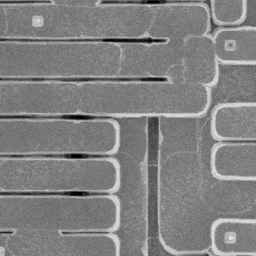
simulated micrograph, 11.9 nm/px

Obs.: wiring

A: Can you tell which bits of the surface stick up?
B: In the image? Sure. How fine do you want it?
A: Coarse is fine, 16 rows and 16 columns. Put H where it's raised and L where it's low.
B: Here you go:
HHHHHHHHHHHHHHHL
HHHHHHHHHHHHHLHL
HHHHHHHHHHHHHHHH
HHHHHHHHHHHHHHHH
HHHHHHHHHHHHHHLL
HHHHHHHHHHHHHLLL
HHHHHHHHHHHHHLLL
HHHHHHHLLLLLLHHH
HHHHHHHLLLLLLLHH
HHHHHHHLLLLLLHHH
HHHHHHHLLLLLLHHH
HHHHHHHLLLLLLLLL
HHHHHHHLLLLLLLLL
HHHHHHHLLLLLLLLL
HHHHHHHLLLLLLHHH
HHHHHHHLLLLLLHHH